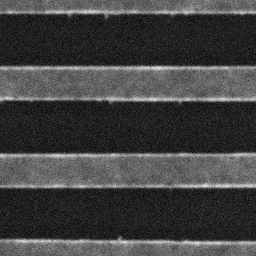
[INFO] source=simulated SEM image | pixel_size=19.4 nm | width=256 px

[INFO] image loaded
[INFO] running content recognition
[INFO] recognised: lines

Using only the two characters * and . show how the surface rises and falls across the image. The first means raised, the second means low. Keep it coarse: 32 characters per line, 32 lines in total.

********************************
********************************
................................
................................
................................
................................
................................
................................
********************************
********************************
********************************
********************************
................................
................................
................................
................................
................................
................................
................................
********************************
********************************
********************************
********************************
................................
................................
................................
................................
................................
................................
................................
********************************
********************************